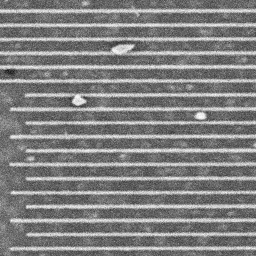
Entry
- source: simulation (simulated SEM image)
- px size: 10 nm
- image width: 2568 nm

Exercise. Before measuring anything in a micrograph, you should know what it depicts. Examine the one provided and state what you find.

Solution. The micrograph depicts parallel lines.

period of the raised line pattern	140	nanometers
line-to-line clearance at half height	0.113	micrometres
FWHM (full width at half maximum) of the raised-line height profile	26.3	nm